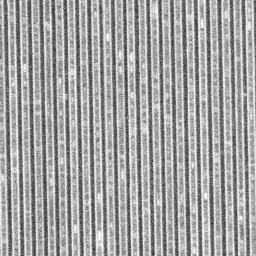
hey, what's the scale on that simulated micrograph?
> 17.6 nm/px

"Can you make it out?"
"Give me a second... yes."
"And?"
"parallel lines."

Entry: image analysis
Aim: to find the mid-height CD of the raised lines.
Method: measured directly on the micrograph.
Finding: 114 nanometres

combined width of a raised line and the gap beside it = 210 nm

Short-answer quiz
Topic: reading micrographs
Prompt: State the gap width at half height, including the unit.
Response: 0.0969 um